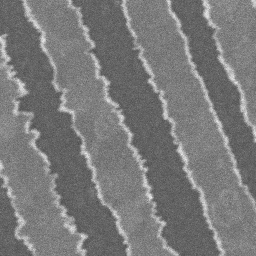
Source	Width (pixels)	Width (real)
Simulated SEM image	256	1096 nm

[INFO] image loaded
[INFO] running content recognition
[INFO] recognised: one or a few lines or trenches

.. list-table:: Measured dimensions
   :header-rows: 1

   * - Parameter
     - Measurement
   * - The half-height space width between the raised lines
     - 170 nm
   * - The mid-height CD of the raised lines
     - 0.196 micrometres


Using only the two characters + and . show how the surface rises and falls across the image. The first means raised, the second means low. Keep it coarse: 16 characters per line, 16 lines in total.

..+++...+++..+++
..+++...+++..+++
...+++..++++..++
...+++...+++..++
+..+++...+++..++
+...+++...+++..+
+...+++...+++..+
++...+++...+++.+
++...+++...+++..
+++..++++..+++..
+++...+++...+++.
+++...+++...+++.
.+++..++++...+++
.+++...+++...+++
.++++...++...+++
..+++...+++...++